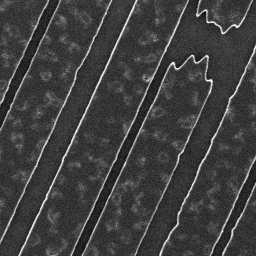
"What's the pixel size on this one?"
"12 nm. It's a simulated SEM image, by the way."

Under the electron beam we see one or a few lines or trenches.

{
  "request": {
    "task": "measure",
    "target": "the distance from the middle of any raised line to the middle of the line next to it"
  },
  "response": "760 nm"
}